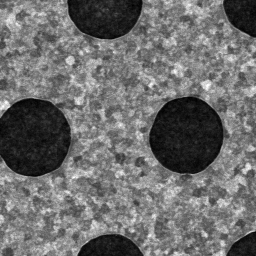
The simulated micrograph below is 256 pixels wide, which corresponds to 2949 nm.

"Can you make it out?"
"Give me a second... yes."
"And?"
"holes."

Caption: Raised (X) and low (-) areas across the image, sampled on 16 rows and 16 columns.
XXXX-----XXXXX--
XXXXX---XXXXXXX-
XXXXXXXXXXXXXXXX
XXXXXXXXXXXXXXXX
XXXXXXXXXXXXXXXX
XXXXXXXXXXXXXXXX
X--XXXXXXX---XXX
----XXXXXX----XX
----XXXXX-----XX
----XXXXXX----XX
X---XXXXXX---XXX
XXXXXXXXXXXXXXXX
XXXXXXXXXXXXXXXX
XXXXXXXXXXXXXXXX
XXXXXXXXXXXXXXXX
XXXXX----XXXXX--